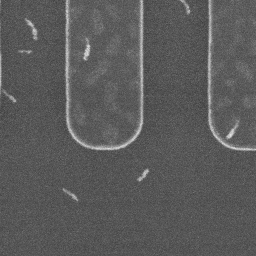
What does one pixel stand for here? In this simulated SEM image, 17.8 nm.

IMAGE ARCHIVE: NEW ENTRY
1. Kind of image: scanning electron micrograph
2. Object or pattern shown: one or a few lines or trenches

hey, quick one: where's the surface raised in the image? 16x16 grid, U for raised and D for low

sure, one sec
DDDDUUUUUDDDDUUU
DDDDUUUUUDDDDUUU
DDDDUUUUUDDDDUUU
DDDDUUUUUDDDDUUU
DDDDUUUUUDDDDUUU
DDDDUUUUUDDDDUUU
DDDDUUUUUDDDDUUU
DDDDUUUUUDDDDUUU
DDDDDUUUDDDDDUUU
DDDDDDDDDDDDDDDD
DDDDDDDDDDDDDDDD
DDDDDDDDDDDDDDDD
DDDDDDDDDDDDDDDD
DDDDDDDDDDDDDDDD
DDDDDDDDDDDDDDDD
DDDDDDDDDDDDDDDD